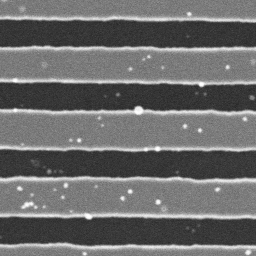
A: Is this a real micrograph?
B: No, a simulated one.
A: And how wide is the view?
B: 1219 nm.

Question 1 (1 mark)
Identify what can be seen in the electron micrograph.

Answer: lines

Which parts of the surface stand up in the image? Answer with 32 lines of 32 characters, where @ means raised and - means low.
@@@@@@@@@@@@@@@@@@@@@@@@@@@@@@@@
@@@@@@@@@@@@@@@@@@@@@@@@@@@@@@@@
-----@@@@-@@@@---@@@@@@@@@@@@@@@
--------------------------------
--------------------------------
--------------------------------
@@@@@@@@@@@@@@@@@@@@@@@@@@@@@@@@
@@@@@@@@@@@@@@@@@@@@@@@@@@@@@@@@
@@@@@@@@@@@@@@@@@@@@@@@@@@@@@@@@
@@@@@@@@@@@@@@@@@@@@@@@@@@@@@@@@
-----------------------@@@@@----
--------------------------------
--------------------------------
-----------------@--------------
@@@@@@@@@@@@@@@@@@@@@@@@@@@@@@@@
@@@@@@@@@@@@@@@@@@@@@@@@@@@@@@@@
@@@@@@@@@@@@@@@@@@@@@@@@@@@@@@@@
@@@@@@@@@@@@@@@@@@@@@@@@@@@@@@@@
@@@@@@@@@@@@@@@@@@@@@@@@@@@@@@@@
--------------------------------
--------------------------------
--------------------------------
@@@@@@@@@@@@@@@@@@@@@@@@--@@-@@@
@@@@@@@@@@@@@@@@@@@@@@@@@@@@@@@@
@@@@@@@@@@@@@@@@@@@@@@@@@@@@@@@@
@@@@@@@@@@@@@@@@@@@@@@@@@@@@@@@@
@@@@@@@@@@@@@@@@@@@@@@@@@@@@@@@@
--------------------------------
--------------------------------
--------------------------------
---@@-@@@-----------------------
@@@@@@@@@@@@@@@@@@@@@@@@@@@@@@@@